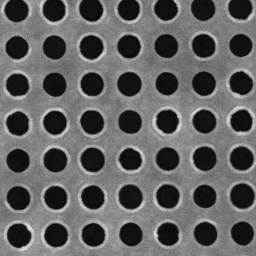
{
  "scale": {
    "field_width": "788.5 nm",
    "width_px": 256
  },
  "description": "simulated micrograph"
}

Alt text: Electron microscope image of a regular array of holes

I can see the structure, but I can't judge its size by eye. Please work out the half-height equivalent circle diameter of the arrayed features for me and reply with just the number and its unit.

71.4 nanometers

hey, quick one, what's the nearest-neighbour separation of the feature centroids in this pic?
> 114 nm